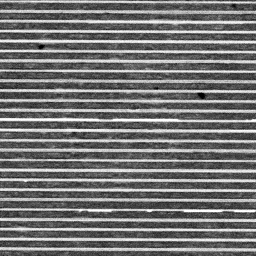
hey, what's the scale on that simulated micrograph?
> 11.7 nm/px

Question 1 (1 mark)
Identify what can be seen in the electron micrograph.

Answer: parallel lines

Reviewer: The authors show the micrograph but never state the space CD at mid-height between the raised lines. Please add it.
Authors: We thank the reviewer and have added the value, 95.3 nm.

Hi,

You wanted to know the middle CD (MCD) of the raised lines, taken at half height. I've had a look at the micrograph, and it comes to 24.9 nm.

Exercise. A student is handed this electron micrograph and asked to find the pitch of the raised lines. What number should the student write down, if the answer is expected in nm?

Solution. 116